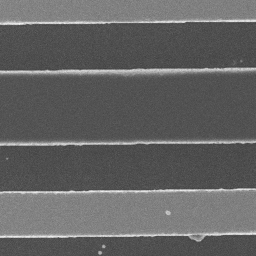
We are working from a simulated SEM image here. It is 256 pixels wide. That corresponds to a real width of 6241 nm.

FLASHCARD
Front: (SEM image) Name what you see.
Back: lines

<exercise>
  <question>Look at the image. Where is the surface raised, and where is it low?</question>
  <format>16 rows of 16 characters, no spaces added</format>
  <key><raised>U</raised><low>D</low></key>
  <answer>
UUUUUUUUUUUUUUUU
UUDDDDDDDDDDDDDD
DDDDDDDDDDDDDDDD
DDDDDDDDDDDDDDDD
DDUUUUUUUUUUUUUU
UUUUUUUUUUUUUUUU
UUUUUUUUUUUUUUUU
UUUUUUUUUUUUUUUU
UUUUUUUUUUUUUUUU
DDDDDDDDDDDDDDDD
DDDDDDDDDDDDDDDD
DDDDDDDDDDDDDDDD
UUUUUUUUUUUUUUUU
UUUUUUUUUUUUUUUU
UUUUUUUUUUUUUUUU
DDDDDDDDDDDDDDDD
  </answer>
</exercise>